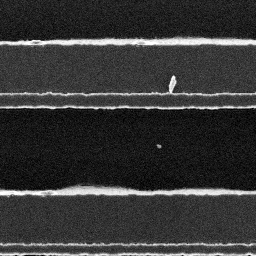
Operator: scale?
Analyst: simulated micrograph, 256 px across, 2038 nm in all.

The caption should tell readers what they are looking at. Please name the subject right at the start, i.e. lines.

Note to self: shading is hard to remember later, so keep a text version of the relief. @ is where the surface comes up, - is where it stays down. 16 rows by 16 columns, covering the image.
----------------
----------------
----------------
@@@@@@@@@@@@@@@@
@@@@@@@@@@@@@@@@
@@@@@@@@@@@@@@@@
@@@@@@@@@@@@@@@@
----------------
----------------
----------------
----------------
----------------
@@@@@@@@@@@@@@@@
@@@@@@@@@@@@@@@@
@@@@@@@@@@@@@@@@
@@@@@@@@@@@@@@@@